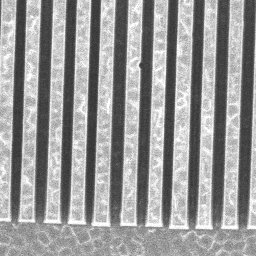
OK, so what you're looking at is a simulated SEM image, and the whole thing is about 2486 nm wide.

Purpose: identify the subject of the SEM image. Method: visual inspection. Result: parallel lines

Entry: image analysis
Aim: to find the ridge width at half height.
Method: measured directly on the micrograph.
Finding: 149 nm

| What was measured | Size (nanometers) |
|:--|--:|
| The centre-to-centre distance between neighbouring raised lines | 246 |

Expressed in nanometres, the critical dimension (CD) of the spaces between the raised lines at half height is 102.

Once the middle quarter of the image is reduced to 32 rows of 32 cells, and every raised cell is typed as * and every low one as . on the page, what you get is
...***...***...****...****..****
...***...***...****...****..****
...***...***...****...****..****
...***...***...****...***...****
...***...***...****...***...****
...***...***....***...***...****
...***...***....***...***...****
..****...***...****...***...****
..****..****...****...***...****
..****..****...****...***...****
..****..****...****...***...****
..****..****...****...***...***.
..****..****...****...***...***.
..****..****...****...***...***.
..****..****...****...***...***.
..****..****...****..****...***.
..****..****...****..****..****.
..****..****...****..****..****.
..****..****...****..****..****.
..****..****...***...****..****.
..****..****...***...****..****.
..****..****...***...****..****.
..****..****...***...****..****.
..****..****...***...****..****.
..****..****...***...****..****.
..****..****...***...****..****.
..***...****...***...****..****.
..***...***....***...****..****.
..***...***....***...****..****.
..***...***....***...****..****.
..***...***....***...****..****.
..***...***....***...****..****.